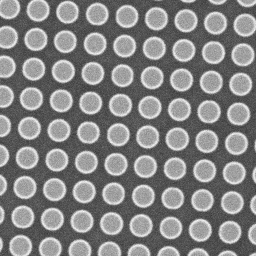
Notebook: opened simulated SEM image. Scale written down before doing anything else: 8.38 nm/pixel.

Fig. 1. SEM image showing an array of small figures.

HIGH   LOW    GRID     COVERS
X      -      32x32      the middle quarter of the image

XX---XXXX-----XX----------------
XXX--XXXXX--XXXXX---XXXX----XX--
XXX--XXXXX--XXXXX--XXXXX---XXXXX
XX---XXXXX--XXXXX--XXXXXX--XXXXX
------XXX---XXXXX---XXXXX--XXXXX
--------------X-----XXXX---XXXXX
----------------------------XXX-
X----XXX------------------------
XX--XXXXX---XXXX----XXX---------
XX--XXXXX--XXXXXX--XXXXX---XXXX-
XX--XXXXX--XXXXXX--XXXXX--XXXXX-
X----XXXX---XXXX---XXXXX--XXXXXX
------------XXXX---XXXXX---XXXX-
---------------------------XXX--
--------------------------------
X---XXXX----XXX-----------------
X---XXXXX--XXXXX---XXXX----XXX--
X---XXXXX--XXXXX--XXXXXX--XXXXX-
X---XXXX---XXXXX--XXXXXX--XXXXX-
-----XX----XXXXX--XXXXX---XXXXX-
-------------------XXX----XXXX--
----------------------------X---
----XXX-----X-------------------
X--XXXXX---XXXX----XXX----------
X--XXXXX--XXXXXX--XXXXX---XXXX--
---XXXXX--XXXXXX--XXXXX--XXXXX--
----XXXX---XXXX---XXXXX--XXXXX--
------------XX----XXXX---XXXXX--
---------------------------XX---
----XX--------------------------
---XXXX----XXX-----XX-----------
--XXXXXX--XXXXX---XXXX---XXXX---